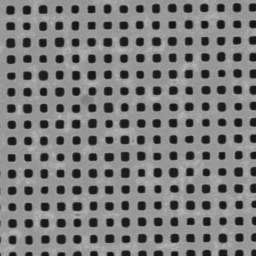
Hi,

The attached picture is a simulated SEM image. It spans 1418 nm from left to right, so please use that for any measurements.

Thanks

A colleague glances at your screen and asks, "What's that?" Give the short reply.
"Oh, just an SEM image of a regular array of holes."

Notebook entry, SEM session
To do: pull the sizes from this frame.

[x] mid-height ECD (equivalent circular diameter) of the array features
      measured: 49.2 nanometers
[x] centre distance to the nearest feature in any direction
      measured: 88.2 nm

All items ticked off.